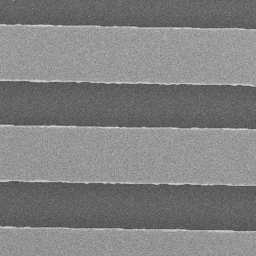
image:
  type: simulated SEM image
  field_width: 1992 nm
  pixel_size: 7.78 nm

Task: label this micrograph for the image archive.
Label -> lines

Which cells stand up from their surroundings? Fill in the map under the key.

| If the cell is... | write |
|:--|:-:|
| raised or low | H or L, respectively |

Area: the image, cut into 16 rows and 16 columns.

LLLLLLLLLLLLLLLL
LLLLLLLLLLLLLLLL
HHHHHHHHHHHHHHHH
HHHHHHHHHHHHHHHH
HHHHHHHHHHHHHHHH
LLLLLLLLLLLLLLLL
LLLLLLLLLLLLLLLL
LLLLLLLLLLLLLLLL
HHHHHHHHHHHHHHHH
HHHHHHHHHHHHHHHH
HHHHHHHHHHHHHHHH
LLLLLLLLLHHHHHHH
LLLLLLLLLLLLLLLL
LLLLLLLLLLLLLLLL
HHHHHHHHHHHHHHHH
HHHHHHHHHHHHHHHH